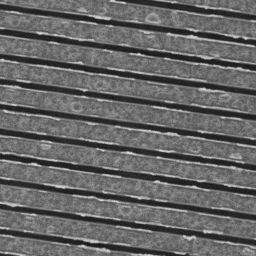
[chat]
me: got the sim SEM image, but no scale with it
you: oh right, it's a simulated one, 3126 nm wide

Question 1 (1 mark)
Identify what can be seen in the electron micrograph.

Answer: parallel lines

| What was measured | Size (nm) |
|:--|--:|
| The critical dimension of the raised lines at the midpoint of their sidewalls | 227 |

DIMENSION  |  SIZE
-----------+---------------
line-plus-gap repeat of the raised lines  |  302 nanometres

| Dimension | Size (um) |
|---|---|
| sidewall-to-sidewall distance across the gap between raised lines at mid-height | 0.0756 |